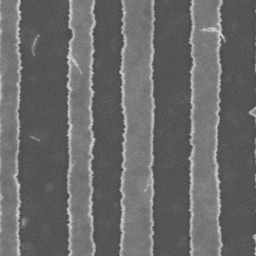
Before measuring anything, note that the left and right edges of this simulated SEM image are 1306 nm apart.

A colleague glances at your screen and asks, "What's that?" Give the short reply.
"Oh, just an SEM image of one or a few lines or trenches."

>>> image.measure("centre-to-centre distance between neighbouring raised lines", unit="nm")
317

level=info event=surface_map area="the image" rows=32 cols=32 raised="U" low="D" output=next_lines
UUDDDDDDDUUUDDDUUUUDDDDDUUUUDDDD
UUDDDDDDDUUUDDDUUUUDDDDDUUUDDDDD
UUDDDDDDDUUUDDDUUUUDDDDDUUUDDDDD
UUDDDDDDDUUUDDDUUUUDDDDDUUUUDDDD
UUDDDDDDDUUUDDDUUUUDDDDDUUUUDDDD
UUDDDDDDDUUUDDDDUUUDDDDDUUUDDDDD
UUDDDDDDDUUUDDDUUUUDDDDDUUUDDDDD
UUUDDDDDUUUUDDDUUUUDDDDDUUUDDDDD
UUDDDDDDDUUDDDDUUUUDDDDDUUUUDDDD
UUDDDDDDDUUDDDDUUUUDDDDDUUUUDDDD
UUDDDDDDUUUDDDDUUUUDDDDDUUUDDDDD
UUDDDDDDDUUUDDDUUUUDDDDDUUUDDDDD
UUDDDDDDDUUDDDDUUUUDDDDDUUUDDDDD
UUDDDDDDDUUDDDDUUUUDDDDDUUUDDDDD
UUDDDDDDDUUDDDDDUUUDDDDDUUUDDDDD
UUDDDDDDDUUDDDDDUUUDDDDDUUUDDDDD
UUDDDDDDDUUUDDDDUUUDDDDDUUUDDDDD
UUDDDDDDDUUUDDDDUUUDDDDDUUUDDDDD
UUDDDDDDDUUDDDDDUUUDDDDDUUUDDDDD
UUDDDDDDDUUDDDDDUUUDDDDDUUUDDDDD
UUDDDDDDDUUDDDDUUUUDDDDDUUUDDDDD
UUDDDDDDDUUDDDDUUUUDDDDDUUUDDDDD
UUDDDDDDDUUDDDDUUUUDDDDDUUUDDDDD
UUDDDDDDDUUDDDDUUUUDDDDDUUUDDDDD
UUDDDDDDDUUDDDDUUUUDDDDDUUUDDDDD
UUDDDDDDDUUDDDDUUUUDDDDDUUUDDDDD
UUDDDDDDDUUDDDDUUUUDDDDDUUUDDDDD
UUDDDDDDDUUDDDDUUUUDDDDDUUUDDDDD
UUDDDDDDDUUUDDDUUUUDDDDDUUUDDDDD
UUDDDDDDDUUDDDDUUUUDDDDDUUUDDDDD
UUDDDDDDDUUUDDDUUUUDDDDDUUUUDDDD
UUDDDDDDDUUUDDDUUUUDDDDDUUUUDDDD